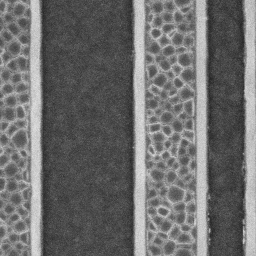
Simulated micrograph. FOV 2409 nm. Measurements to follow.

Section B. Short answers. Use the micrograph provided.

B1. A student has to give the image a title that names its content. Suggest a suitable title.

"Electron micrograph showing one or a few lines or trenches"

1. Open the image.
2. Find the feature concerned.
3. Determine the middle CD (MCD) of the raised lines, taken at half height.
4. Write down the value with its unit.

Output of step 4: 579 nm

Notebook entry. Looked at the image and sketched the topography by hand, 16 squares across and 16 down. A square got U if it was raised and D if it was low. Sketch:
UUDDDDDDDUUUUDDD
UUDDDDDDDUUUUDDD
UUDDDDDDDUUUUDDD
UUDDDDDDDUUUUDDD
UUDDDDDDDUUUUDDD
UUDDDDDDDUUUUDDD
UUDDDDDDDUUUUDDD
UUDDDDDDDUUUUDDD
UUDDDDDDDUUUUDDD
UUDDDDDDDUUUUDDD
UUDDDDDDDUUUUDDD
UUDDDDDDDUUUUDDD
UUDDDDDDDUUUUDDD
UUDDDDDDDUUUUDDD
UUDDDDDDDUUUUDDD
UUDDDDDDDUUUUDDD